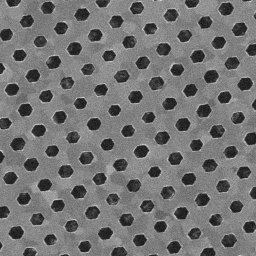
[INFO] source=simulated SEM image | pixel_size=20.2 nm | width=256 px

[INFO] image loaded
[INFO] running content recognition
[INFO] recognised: a regular array of holes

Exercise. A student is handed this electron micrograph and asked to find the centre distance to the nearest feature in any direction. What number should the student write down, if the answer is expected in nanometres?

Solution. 493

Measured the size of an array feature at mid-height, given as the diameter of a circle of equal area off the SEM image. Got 275 nm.